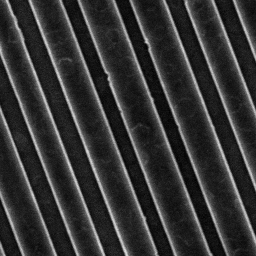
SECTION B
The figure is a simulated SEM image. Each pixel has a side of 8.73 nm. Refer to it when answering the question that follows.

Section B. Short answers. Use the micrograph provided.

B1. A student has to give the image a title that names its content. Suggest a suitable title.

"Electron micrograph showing parallel lines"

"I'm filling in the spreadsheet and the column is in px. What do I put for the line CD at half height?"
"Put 30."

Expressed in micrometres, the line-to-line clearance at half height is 0.16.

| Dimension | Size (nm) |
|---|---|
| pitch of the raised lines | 418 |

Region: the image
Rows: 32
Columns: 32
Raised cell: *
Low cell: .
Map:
*...****..****..*****..****..***
*...****..*****..****...***...**
**...****..****..****...****..**
**...****..*****..****..****...*
***..****..*****..****...***...*
***...****..****..*****..****..*
***...****..*****..****..****...
****..****...****..****...***...
.***...****..****...****..****..
.****..****..*****..****...***..
..***...****..****..*****..****.
..***...****..*****..****..****.
..****..****..*****..****...***.
...***...****..****..*****..****
...***...****..*****..****...***
*..****...****..****..****...***
*...***...****..****...****..***
*...****..****..*****..****...**
**...***...****..****..*****..**
**...***...****..*****..****..**
***..****..****..*****..****...*
***...***...****..****..*****..*
***...***...****..*****..****...
****..****...****..****..****...
****...***...****..*****..****..
*****..****..****..*****..****..
.****...***...****..****..*****.
.****...***...****..*****..****.
..****..****..****...****..****.
..****...***...****..****...****
..****...***...****..*****..****
...****...***...****..****..****